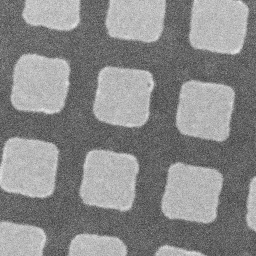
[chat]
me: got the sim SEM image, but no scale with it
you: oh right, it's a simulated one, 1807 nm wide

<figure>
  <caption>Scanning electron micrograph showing raised bodies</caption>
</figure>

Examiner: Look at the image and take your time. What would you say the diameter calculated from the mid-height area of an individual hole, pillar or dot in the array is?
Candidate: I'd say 416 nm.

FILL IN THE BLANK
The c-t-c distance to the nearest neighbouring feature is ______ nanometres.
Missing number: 592